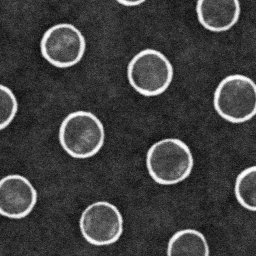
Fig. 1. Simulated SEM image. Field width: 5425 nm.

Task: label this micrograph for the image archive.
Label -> raised bodies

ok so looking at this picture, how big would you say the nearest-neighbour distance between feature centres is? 1920 nm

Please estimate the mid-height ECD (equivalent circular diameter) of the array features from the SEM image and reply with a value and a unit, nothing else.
875 nanometers